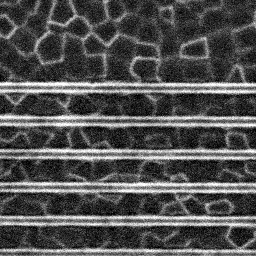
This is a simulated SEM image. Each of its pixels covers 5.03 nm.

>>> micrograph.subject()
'parallel lines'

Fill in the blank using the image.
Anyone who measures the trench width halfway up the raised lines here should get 25.8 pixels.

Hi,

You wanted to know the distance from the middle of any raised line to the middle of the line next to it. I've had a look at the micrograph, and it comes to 167 nm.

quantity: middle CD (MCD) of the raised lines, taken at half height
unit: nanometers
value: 37.1